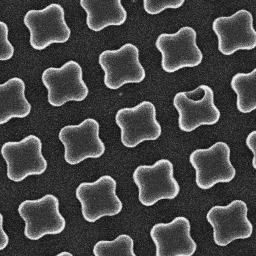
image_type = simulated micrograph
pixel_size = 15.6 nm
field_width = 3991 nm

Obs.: a regular array of raised bodies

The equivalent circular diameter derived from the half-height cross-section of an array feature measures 649 nm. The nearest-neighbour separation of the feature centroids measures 932 nm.